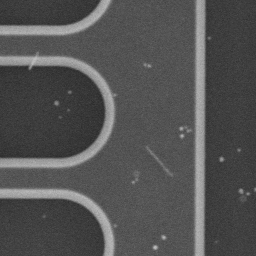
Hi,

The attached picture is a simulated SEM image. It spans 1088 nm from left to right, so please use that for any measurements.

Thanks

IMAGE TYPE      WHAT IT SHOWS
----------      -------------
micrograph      groups of lines, slits or small figures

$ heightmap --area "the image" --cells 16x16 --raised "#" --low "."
......#######...
.....########...
#############...
#############...
......#######...
......#######...
.......######...
.......######...
......#######...
......#######...
#############...
############....
.....#######....
......######....
.......#####....
.......#####....